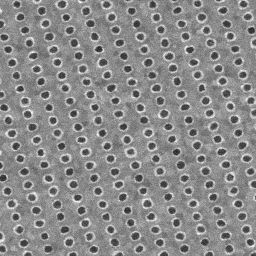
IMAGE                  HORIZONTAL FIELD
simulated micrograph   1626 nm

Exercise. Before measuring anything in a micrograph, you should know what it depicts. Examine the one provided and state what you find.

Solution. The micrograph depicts a regular array of holes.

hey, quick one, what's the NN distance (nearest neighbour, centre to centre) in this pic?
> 0.0841 microns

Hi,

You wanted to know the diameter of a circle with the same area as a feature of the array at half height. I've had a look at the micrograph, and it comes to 0.0501 microns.